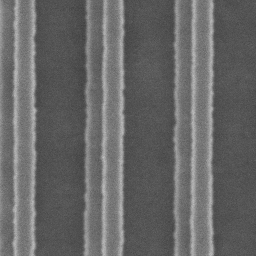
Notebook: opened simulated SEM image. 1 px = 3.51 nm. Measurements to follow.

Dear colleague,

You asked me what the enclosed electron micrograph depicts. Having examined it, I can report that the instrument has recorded lines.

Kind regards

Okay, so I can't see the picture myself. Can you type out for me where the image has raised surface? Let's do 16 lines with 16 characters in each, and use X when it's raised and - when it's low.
XX---XXX---XX---
XX---XXX---XX---
XX---XXX---XX---
XX---XXX---XX---
XX---XXX---XX---
XX---XXX---XX---
XX---XXX---XX---
XX---XXX---XX---
XX---XXX---XX---
XX---XXX---XX---
XX---XXX---XX---
XX---XXX---XX---
XX---XXX---XX---
XX---XXX---XX---
XX---XXX---XX---
XX---XXX---XX---